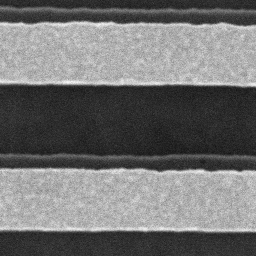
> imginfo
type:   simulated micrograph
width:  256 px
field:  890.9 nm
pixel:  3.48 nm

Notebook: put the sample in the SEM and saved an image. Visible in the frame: lines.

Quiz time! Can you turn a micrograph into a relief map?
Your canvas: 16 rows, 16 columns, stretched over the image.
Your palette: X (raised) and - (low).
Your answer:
----------------
XXXXXXXXXXXX-X--
XXXXXXXXXXXXXXXX
XXXXXXXXXXXXXXXX
XXXXXXXXXXXXXXXX
----------------
----------------
----------------
----------------
----------------
----------------
XXXXXXXXXXXXXXXX
XXXXXXXXXXXXXXXX
XXXXXXXXXXXXXXXX
----------------
----------------